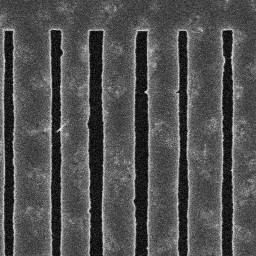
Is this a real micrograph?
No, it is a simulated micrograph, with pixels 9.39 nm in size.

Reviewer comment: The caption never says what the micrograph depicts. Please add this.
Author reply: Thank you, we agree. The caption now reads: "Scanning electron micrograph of parallel lines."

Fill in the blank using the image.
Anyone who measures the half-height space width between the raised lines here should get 93.9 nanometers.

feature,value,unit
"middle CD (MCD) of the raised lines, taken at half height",0.304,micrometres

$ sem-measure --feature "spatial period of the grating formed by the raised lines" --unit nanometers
404